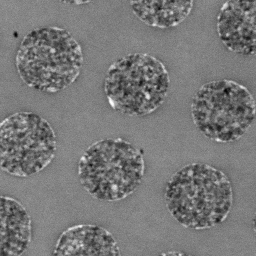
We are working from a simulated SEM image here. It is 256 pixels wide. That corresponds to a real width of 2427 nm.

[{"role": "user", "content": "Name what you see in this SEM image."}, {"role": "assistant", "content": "raised bodies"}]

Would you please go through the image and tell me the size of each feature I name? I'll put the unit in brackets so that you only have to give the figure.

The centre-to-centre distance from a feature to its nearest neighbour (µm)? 0.845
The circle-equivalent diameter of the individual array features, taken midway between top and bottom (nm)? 595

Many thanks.